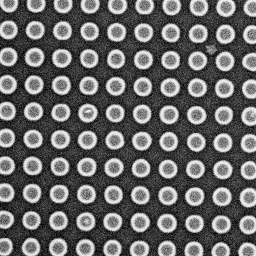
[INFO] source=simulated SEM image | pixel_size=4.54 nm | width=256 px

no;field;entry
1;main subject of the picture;an array of small figures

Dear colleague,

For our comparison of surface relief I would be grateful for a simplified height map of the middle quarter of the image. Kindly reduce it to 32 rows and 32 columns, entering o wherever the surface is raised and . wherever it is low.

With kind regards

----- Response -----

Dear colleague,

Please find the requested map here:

o....ooo....oo....oooo...oooo..o
................................
................................
o....oo.....oo.....oo...........
o...oooo...oooo...oooo...ooo....
oo..oooo...oooo...oooo..ooooo..o
o...oooo...oooo...oooo..ooooo..o
.....oo.....oo....ooo....ooo....
................................
................................
o....oo.....oo.....oo...........
o...oooo...oooo...ooo...oooo...o
o...oooo...oooo..ooooo..oooo...o
o...oooo...oooo...oooo..oooo...o
............o.....ooo....ooo....
................................
................................
o...oooo...ooo....ooo....ooo....
o...oooo...oooo..ooooo..oooo...o
o...oooo...oooo..ooooo..oooo...o
o...oooo...oooo..oooo...oooo...o
..........................o.....
................................
................................
o...oooo...ooo....ooo....oo....o
o..ooooo..ooooo..oooo...oooo...o
o..ooooo..ooooo..oooo...oooo...o
....ooo....ooo...oooo...oooo...o
................................
................................
.....o..........................
o...oooo...ooo...oooo...oooo...o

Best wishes